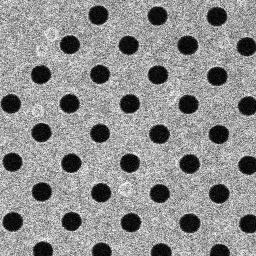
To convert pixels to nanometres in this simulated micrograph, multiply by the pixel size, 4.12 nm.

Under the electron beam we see a regular array of holes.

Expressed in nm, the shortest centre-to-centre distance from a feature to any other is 169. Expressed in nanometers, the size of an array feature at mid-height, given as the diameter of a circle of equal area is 77.1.